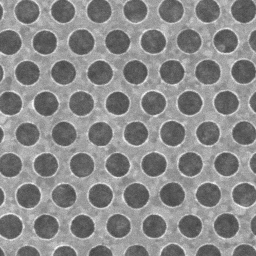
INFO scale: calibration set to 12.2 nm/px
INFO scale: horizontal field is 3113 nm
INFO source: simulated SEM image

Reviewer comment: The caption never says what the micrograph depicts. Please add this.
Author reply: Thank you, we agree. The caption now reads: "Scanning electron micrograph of a regular array of holes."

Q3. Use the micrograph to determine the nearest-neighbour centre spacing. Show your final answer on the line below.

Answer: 430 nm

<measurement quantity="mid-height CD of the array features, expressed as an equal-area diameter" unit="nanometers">310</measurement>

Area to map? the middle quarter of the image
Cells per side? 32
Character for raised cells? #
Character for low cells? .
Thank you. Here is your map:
...###......###......###......##
...###......###......###......##
...###......###......###......##
...###......###......###......##
..#####.....####....#####....###
################################
################################
##....######...#####.....####...
#......####.....###......###....
#.......##.......##.......##....
#.......##......###.......##....
##.....####.....####.....####...
##....######...######...######..
################################
.#######..#######..######...####
..#####.....###.....####......##
...###......###......###......##
...###......###......###.......#
...###......###......###......##
...###......####....#####.....##
.#######..########.#######...###
################################
###...######...######...######..
##.....####.....####.....####...
#.......##......###.......##....
#.......##.......##.......##....
##......###.....###......####...
##.....#####....####.....#####..
####.###########################
###########################.####
..#####....#####....#####.....##
...###......###......###......##